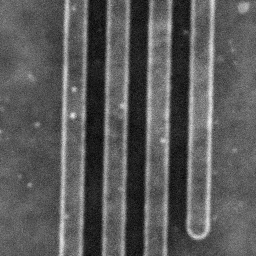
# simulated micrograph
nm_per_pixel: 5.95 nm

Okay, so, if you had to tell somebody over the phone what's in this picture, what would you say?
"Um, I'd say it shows groups of lines, slits or small figures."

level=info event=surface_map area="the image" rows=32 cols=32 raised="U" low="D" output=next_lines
DDDDDDDDUUUDDDUUDDDUUDDDUUUDDDDD
DDDDDDDDUUUDDDUUDDDUUDDDUUUDDDDD
DDDDDDDDUUUDDUUUDDDUUDDDUUUDDDDD
DDDDDDDDUUUDDUUUDDDUUDDDUUDDDDDD
DDDDDDDDUUUDDUUUDDDUUDDDUUDDDDDD
DDDDDDDDUUUDDUUUDDDUUDDDUUDDDDDD
DDDDDDDDUUUDDUUUDDDUUDDDUUDDDDDD
DDDDDDDDUUUDDUUUDDDUUDDDUUDDDDDD
DDDDDDDDUUUDDUUUDDDUUDDDUUDDDDDD
DDDDDDDDUUUDDUUUDDDUUDDDUUDDDDDD
DDDDDDDDUUUDDUUUDDDUUDDDUUDDDDDD
DDDDDDDDUUUDDUUUDDDUUDDDUUDDDDDD
DDDDDDDDUUUDDUUUDDDUUDDDUUDDDDDD
DDDDDDDDUUUDDUUUDDUUUDDDUUDDDDDD
DDDDDDDDUUUDDUUUDDUUUDDDUUDDDDDD
DDDDDDDDUUUDDUUUDDUUUDDDUUDDDDDD
DDDDDDDDUUDDDUUUDDUUUDDDUUDDDDDD
DDDDDDDDUUDDDUUUDDUUUDDDUUDDDDDD
DDDDDDDDUUDDDUUUDDUUUDDDUUDDDDDD
DDDDDDDDUUDDDUUUDDUUUDDDUUDDDDDD
DDDDDDDDUUDDDUUUDDUUUDDDUUDDDDDD
DDDDDDDDUUDDDUUUDDUUUDDDUUDDDDDD
DDDDDDDDUUDDDUUUDDUUUDDDUUDDDDDD
DDDDDDDDUUDDDUUUDDUUUDDDUUDDDDDD
DDDDDDDDUUDDDUUUDDUUUDDDUUDDDDDD
DDDDDDDDUUDDDUUUDDUUUDDDUUDDDDDD
DDDDDDDDUUDDDUUUDDUUUDDUUUDDDDDD
DDDDDDDDUUDDDUUUDDUUUDDUUUDDDDDD
DDDDDDDDUUDDDUUDDDUUUDDUUUDDDDDD
DDDDDDDDUUDDDUUDDDUUUDDDUDDDDDDD
DDDDDDDDUUDDDUUDDDUUUDDDDDDDDDDD
DDDDDDDDUUDDDUUDDDUUUDDDDDDDDDDD